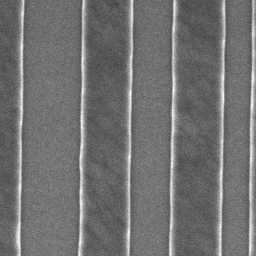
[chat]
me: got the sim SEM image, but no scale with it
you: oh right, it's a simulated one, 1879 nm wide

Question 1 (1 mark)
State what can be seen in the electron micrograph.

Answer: wiring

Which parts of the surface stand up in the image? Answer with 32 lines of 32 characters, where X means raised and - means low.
XXX-------XXXXXXX-----XXXXXX----
XXX-------XXXXXXX-----XXXXXX----
XXX-------XXXXXXX-----XXXXXX----
XXX-------XXXXXXX-----XXXXXX----
XXX-------XXXXXXX-----XXXXXX----
XXX-------XXXXXXX-----XXXXXX----
XXX-------XXXXXXX-----XXXXXX----
XXX-------XXXXXXX-----XXXXXX----
XXX-------XXXXXX------XXXXXX----
XXX-------XXXXXX------XXXXXX----
XXX-------XXXXXX------XXXXXX---X
XXX-------XXXXXX------XXXXXX---X
XXX-------XXXXXX------XXXXXX---X
XXX-------XXXXXX------XXXXXX---X
XXX-------XXXXXX------XXXXXX---X
XXX-------XXXXXX------XXXXXX---X
XXX-------XXXXXX-----XXXXXXX---X
XXX-------XXXXXX-----XXXXXXX---X
XXX-------XXXXXX-----XXXXXXX---X
XXX-------XXXXXX-----XXXXXXX---X
XXX-------XXXXXX-----XXXXXXX---X
XXX-------XXXXXX-----XXXXXXX---X
XXX-------XXXXXX-----XXXXXXX---X
XXX-------XXXXXX-----XXXXXXX---X
XXX-------XXXXXX-----XXXXXXX---X
XXX-------XXXXXX-----XXXXXXX---X
XXX-------XXXXXX-----XXXXXXX---X
XXX-------XXXXXX-----XXXXXXX---X
XX--------XXXXXX-----XXXXXXX---X
XX--------XXXXXX-----XXXXXXX---X
XXX-------XXXXXX-----XXXXXXX---X
XXX-------XXXXXX-----XXXXXXX---X